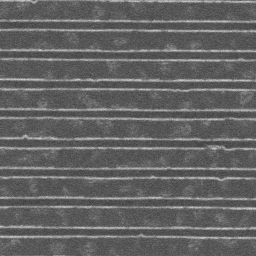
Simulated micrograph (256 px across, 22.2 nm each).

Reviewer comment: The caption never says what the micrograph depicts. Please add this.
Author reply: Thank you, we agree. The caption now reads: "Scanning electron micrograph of parallel lines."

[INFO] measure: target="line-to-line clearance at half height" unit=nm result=197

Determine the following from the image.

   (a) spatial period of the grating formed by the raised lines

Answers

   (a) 0.655 um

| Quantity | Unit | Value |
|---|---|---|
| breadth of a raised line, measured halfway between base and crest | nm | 475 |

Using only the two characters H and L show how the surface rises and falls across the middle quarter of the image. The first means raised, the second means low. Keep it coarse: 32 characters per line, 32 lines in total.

HHHHHHHHHHHHHHHHHHHHHHHHHHHHHHHH
HHHHHHHHHHHHHHHHHHHHHHHHHHHHHHHH
HHHHHHHHHHHHHHHHHHHHHHHHHHHHHHHH
HHHHHHHHHHHHHHHHHHHHHHHHHHHHHHHH
LLLLLLLLLLLLLLLLLLLLLLLLLLLLLLLL
LLLLLLLLLLLLLLLLLLLLLLLLLLLLLLLL
HHHHHHHHHHHHHHHHHHHHHHHHHHHLHLLH
HHHHHHHHHHHHHHHHHHHHHHHHHHHHHHHH
HHHHHHHHHHHHHHHHHHHHHHHHHHHHHHHH
HHHHHHHHHHHHHHHHHHHHHHHHHHHHHHHH
HHHHHHHHHHHHHHHHHHHHHHHHHHHHHHHH
LLLLLLLLLLLLLLLLLHHHHHHHHHHHHHHH
LLLLLLLLLLLLLLLLLLLLLLLLLLLLLLLL
LLLLLLLLLLLLLLLLLLLLLLLLLLLLLLLL
HHHHHHHHHHHHHHHHHHHHHHHHHHHHHHHH
HHHHHHHHHHHHHHHHHHHHHHHHHHHHHHHH
HHHHHHHHHHHHHHHHHHHHHHHHHHHHHHHH
HHHHHHHHHHHHHHHHHHHHHHHHHHHHHHHH
HHHHHHHHHHHHHHHHHHHHHHHHHHHHHHHH
LLLLLLLLLLLLLLLLLLLLLLLLLLLLLLLL
LLLLLLLLLLLLLLLLLLLLLLLLLLLLLLLL
HHHHHHHHHHHHHHHHHHHHHHHHHHHHHHHH
HHHHHHHHHHHHHHHHHHHHHHHHHHHHHHHH
HHHHHHHHHHHHHHHHHHHHHHHHHHHHHHHH
HHHHHHHHHHHHHHHHHHHHHHHHHHHHHHHH
HHHHHHHHHHHHHHHHHHHHHHHHHHHHHHHH
LLLLLLLLLLLLLLLLLLLLLLLLLLLLLLLL
LLLLLLLLLLLLLLLLLLLLLLLLLLLLLLLL
HHHHHHLLLLLLLLLLHHHLLLHLLLLLLLLL
HHHHHHHHHHHHHHHHHHHHHHHHHHHHHHHH
HHHHHHHHHHHHHHHHHHHHHHHHHHHHHHHH
HHHHHHHHHHHHHHHHHHHHHHHHHHHHHHHH